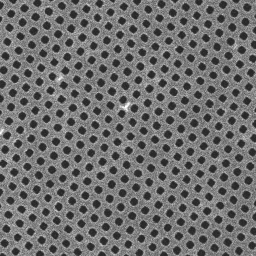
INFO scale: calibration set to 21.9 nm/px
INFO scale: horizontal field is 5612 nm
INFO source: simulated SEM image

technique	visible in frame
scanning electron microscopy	a regular array of holes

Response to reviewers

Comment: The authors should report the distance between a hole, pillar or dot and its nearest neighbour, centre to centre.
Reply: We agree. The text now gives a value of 307 nm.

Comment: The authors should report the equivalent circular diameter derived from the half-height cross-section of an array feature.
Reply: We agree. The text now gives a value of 0.18 µm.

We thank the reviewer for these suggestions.